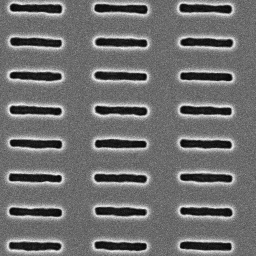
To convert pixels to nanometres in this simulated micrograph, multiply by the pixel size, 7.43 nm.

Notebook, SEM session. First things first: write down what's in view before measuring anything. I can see a regular array of holes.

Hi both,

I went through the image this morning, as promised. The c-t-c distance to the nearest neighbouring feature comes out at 250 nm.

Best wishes